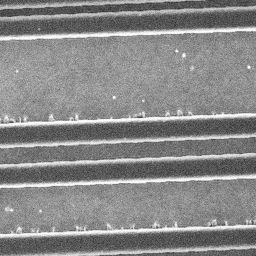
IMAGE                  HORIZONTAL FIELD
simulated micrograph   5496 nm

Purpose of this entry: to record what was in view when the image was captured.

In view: lines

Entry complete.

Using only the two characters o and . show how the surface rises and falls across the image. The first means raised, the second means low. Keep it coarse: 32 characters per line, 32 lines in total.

oooooooooooo....................
...................ooooooooooooo
oooooooooooooooooooooooooooooooo
oooooooooooooooooooooooooooooooo
ooooooooo.......................
................................
................................
................................
................................
................................
................................
................................
................................
................................
.............................ooo
...ooooooooooooooooooooooooooooo
oooooooooooooooooooooooooooooooo
ooooooooooooooooooo.............
................................
...........................ooooo
....oooooooooooooooooooooooooooo
oooooooooooooooooooooooooooooooo
oooooooooooooooooooooo..........
................................
................................
................................
................................
................................
.........................ooooooo
oooooooooooooooooooooooooooooooo
oooooooooooooooooooooooooooooooo
ooooooooooooooooooo.............